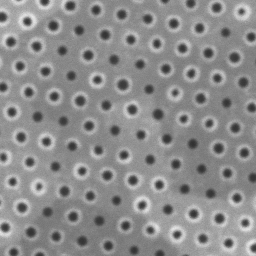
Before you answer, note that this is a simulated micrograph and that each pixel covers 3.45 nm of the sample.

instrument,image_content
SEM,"a regular array of holes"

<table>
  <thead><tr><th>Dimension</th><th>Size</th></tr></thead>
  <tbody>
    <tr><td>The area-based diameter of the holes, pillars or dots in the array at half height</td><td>33.7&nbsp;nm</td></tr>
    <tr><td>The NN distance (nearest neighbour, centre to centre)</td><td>89.9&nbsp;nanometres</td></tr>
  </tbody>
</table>